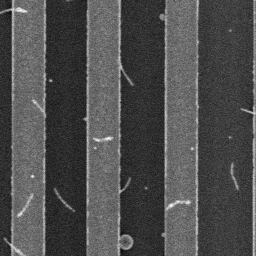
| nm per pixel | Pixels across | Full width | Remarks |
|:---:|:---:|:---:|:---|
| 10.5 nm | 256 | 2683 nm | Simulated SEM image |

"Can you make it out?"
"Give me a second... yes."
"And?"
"lines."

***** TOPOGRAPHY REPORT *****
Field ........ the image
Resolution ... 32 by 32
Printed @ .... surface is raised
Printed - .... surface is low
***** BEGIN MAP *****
--@@@@-----@@@@------@@@@-------
-@@@@@-----@@@@------@@@@-------
--@@@@-----@@@@------@@@@-------
--@@@@-----@@@@------@@@@-------
--@@@@-----@@@@------@@@@-------
--@@@@-----@@@@------@@@@-------
--@@@@-----@@@@------@@@@-------
--@@@@-----@@@@------@@@@-------
--@@@@-----@@@@------@@@@-------
--@@@@-----@@@@------@@@@-------
--@@@@-----@@@@------@@@@-------
--@@@@-----@@@@------@@@@-------
--@@@@-----@@@@------@@@@-------
--@@@@-----@@@@------@@@@-------
--@@@@-----@@@@------@@@@-------
--@@@@-----@@@@------@@@@-------
--@@@@-----@@@@------@@@@-------
--@@@@-----@@@@------@@@@-------
--@@@@-----@@@@------@@@@-------
--@@@@-----@@@@------@@@@-------
--@@@@-----@@@@------@@@@-------
--@@@@-----@@@@------@@@@-------
--@@@@-----@@@@------@@@@-------
--@@@@-----@@@@------@@@@-------
--@@@@-----@@@@------@@@@-------
--@@@@-----@@@@------@@@@-------
--@@@@-----@@@@------@@@@-------
--@@@@-----@@@@------@@@@-------
--@@@@-----@@@@------@@@@-------
--@@@@-----@@@@------@@@@-------
-@@@@@-----@@@@------@@@@-------
-@@@@@-----@@@@------@@@@-------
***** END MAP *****